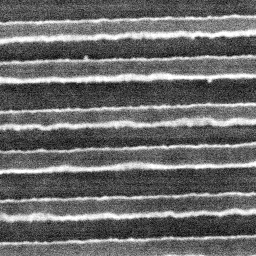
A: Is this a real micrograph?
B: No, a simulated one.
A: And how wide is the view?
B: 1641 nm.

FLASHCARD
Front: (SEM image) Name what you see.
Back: lines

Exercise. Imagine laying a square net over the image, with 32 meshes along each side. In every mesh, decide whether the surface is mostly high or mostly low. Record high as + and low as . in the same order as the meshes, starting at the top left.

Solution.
................................
................................
............++++++++++++++++++++
++++++++++++++++++++++++++++++++
++++++++++++++++++++++....+.....
................................
................................
.......++.++++++++++++++++++++++
++++++++++++++++++++++++++++++++
++++++++++++++++++++++++++++++++
................................
................................
................................
............++++++++++++++++++++
++++++++++++++++++++++++++++++++
++++++++++++++++++++++..........
................................
................................
.................+++++++++++++++
++++++++++++++++++++++++++++++++
++++++++++++++++++++++++++++++++
+...............................
................................
................................
.......................+++++++++
++++++++++++++++++++++++++++++++
+++++++++++++++++++++++++++++.++
................................
................................
...............................+
++++++++++++++++++++++++++++++++
++++++++++++++++++++++++++++++++